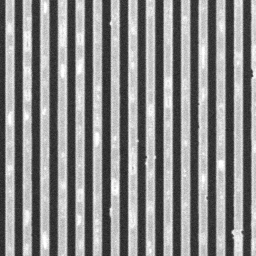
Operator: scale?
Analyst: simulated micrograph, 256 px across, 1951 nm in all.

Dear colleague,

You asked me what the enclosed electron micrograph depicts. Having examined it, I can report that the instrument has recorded parallel lines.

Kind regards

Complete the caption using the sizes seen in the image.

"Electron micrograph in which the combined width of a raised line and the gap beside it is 0.134 micrometres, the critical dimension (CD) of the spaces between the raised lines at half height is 72.4 nanometres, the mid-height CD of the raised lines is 65.8 nanometres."